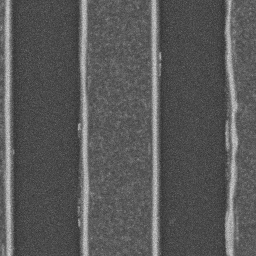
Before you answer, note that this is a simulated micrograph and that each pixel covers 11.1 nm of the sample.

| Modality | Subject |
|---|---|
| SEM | one or a few lines or trenches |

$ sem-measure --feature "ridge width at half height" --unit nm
774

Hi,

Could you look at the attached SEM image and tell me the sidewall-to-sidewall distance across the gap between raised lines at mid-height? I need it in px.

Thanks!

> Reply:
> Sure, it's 77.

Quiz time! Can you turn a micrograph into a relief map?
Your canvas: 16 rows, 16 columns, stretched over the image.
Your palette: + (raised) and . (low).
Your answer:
.....+++++....++
.....+++++....++
.....+++++....++
.....+++++....++
.....+++++....++
.....+++++.....+
.....+++++.....+
.....+++++.....+
.....+++++.....+
.....+++++.....+
.....+++++.....+
.....+++++.....+
.....+++++....++
+....+++++....++
+....+++++....++
+....+++++....++